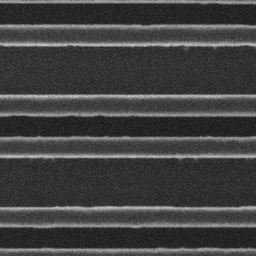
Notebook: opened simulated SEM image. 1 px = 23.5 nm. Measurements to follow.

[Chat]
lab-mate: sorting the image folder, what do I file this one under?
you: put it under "lines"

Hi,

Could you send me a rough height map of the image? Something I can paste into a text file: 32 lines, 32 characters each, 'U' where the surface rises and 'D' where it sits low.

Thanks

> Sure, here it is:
DDDDDDDDDDDDDDDDDDDDDDDDDDDDDDDD
DDDDDDDDDDDDDDDDDDDDDDDDDDDDDDDD
DDDDDDDDDDDDDDDDDDDDDDDDDDDDDDDD
UUUUUUUUUUUUUUUUUUUUUUUUUUUUUUUU
UUUUUUUUUUUUUUUUUUUUUUUUUUUUUUUU
UUUUUUUUUUUUUUUUUUUUUUUUUUUUUUUU
DDDDDDDDDDDDDDDDDDDDDDDDDDDDDDDD
DDDDDDDDDDDDDDDDDDDDDDDDDDDDDDDD
DDDDDDDDDDDDDDDDDDDDDDDDDDDDDDDD
DDDDDDDDDDDDDDDDDDDDDDDDDDDDDDDD
DDDDDDDDDDDDDDDDDDDDDDDDDDDDDDDD
DDDDDDDDDDDDDDDDDDDDDDDDDDDDDDDD
UUUUUUUUUUUUUUUUUUUUUUUUUUUUUUUU
UUUUUUUUUUUUUUUUUUUUUUUUUUUUUUUU
DDDDDDDDDDDDDDDDDDDDDDDDDDDDDDDD
DDDDDDDDDDDDDDDDDDDDDDDDDDDDDDDD
DDDDDDDDDDDDDDDDDDDDDDDDDDDDDDDD
UUUUUUUUUUUUUUUUUUUUUUUUUUUUUUUU
UUUUUUUUUUUUUUUUUUUUUUUUUUUUUUUU
UUUUUUUUUUUUUUUUUUUUUUUUUUUUUUUU
DDDDDDDDDDDDDDDDDDDDDDDDDDDDDDDD
DDDDDDDDDDDDDDDDDDDDDDDDDDDDDDDD
DDDDDDDDDDDDDDDDDDDDDDDDDDDDDDDD
DDDDDDDDDDDDDDDDDDDDDDDDDDDDDDDD
DDDDDDDDDDDDDDDDDDDDDDDDDDDDDDDD
DDDDDDDDDDDDDDDDDDDDDDDDDDDDDDDD
UUUUUUUUUUUUUUUUUUUUUUUUUUUUUUUU
UUUUUUUUUUUUUUUUUUUUUUUUUUUUUUUU
DDDDDDDDDDDDDDDDDDDDDDDDDDDDDDDD
DDDDDDDDDDDDDDDDDDDDDDDDDDDDDDDD
DDDDDDDDDDDDDDDDDDDDDDDDDDDDDDDD
UUUUUUUUUUUUUUUUUUUUUUUUUUUUUUUU